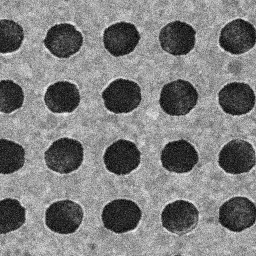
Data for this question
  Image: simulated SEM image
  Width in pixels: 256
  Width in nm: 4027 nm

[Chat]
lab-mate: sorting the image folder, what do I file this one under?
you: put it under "a regular array of holes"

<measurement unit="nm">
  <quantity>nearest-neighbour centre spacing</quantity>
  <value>895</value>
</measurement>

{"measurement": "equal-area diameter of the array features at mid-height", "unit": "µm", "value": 0.59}